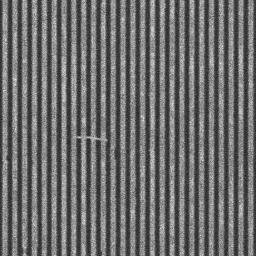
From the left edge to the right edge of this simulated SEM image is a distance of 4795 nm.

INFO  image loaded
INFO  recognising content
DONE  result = parallel lines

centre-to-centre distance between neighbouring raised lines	0.184	micrometres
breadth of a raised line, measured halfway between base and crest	0.0796	um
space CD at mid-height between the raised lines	98.3	nm